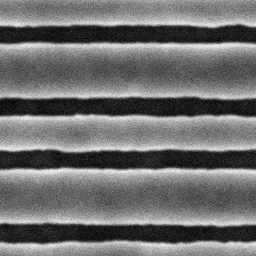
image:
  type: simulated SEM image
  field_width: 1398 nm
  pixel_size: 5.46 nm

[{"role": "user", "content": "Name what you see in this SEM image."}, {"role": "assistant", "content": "lines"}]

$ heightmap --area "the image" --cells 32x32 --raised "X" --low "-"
XXXXXXXXXXXXXXXXXXXXXXXXXXXXXXXX
XXXXXXXXXXXXXXXXXXXXXXXXXXXXXXXX
XXXXXXXXXXXXXXXXXXXXXXXXXXXXXXXX
--------------------------------
--------------------------------
---XXXX-----XX---XXX--------XXX-
XXXXXXXXXXXXXXXXXXXXXXXXXXXXXXXX
XXXXXXXXXXXXXXXXXXXXXXXXXXXXXXXX
XXXXXXXXXXXXXXXXXXXXXXXXXXXXXXXX
XXXXXXXXXXXXXXXXXXXXXXXXXXXXXXXX
XXXXXXXXXXXXXXXXXXXXXXXXXXXXXXXX
XXXXXXXXXXXXXXXXXXXXXXXXXXXXXXXX
--------------------------------
--------------------------------
---------X-X--------------------
XXXXXXXXXXXXXXXXXXXXXXXXXXXXXXXX
XXXXXXXXXXXXXXXXXXXXXXXXXXXXXXXX
XXXXXXXXXXXXXXXXXXXXXXXXXXXXXXXX
XXXXXXXXXXXXXXXXXXXXXXXXXXXXXXXX
--------------------------------
--------------------------------
XXXXXXXXXXXXXXXXXXXXXXXXXXXXXXXX
XXXXXXXXXXXXXXXXXXXXXXXXXXXXXXXX
XXXXXXXXXXXXXXXXXXXXXXXXXXXXXXXX
XXXXXXXXXXXXXXXXXXXXXXXXXXXXXXXX
XXXXXXXXXXXXXXXXXXXXXXXXXXXXXXXX
XXXXXXXXXXXXXXXXXXXXXXXXXXXXXXXX
XXXXXXXXXXXXXXXXXXXXXXXXXXXXXXXX
--------------------------------
--------------------------------
X------XXXXXXXXXXXXXX-XXXXXXXXXX
XXXXXXXXXXXXXXXXXXXXXXXXXXXXXXXX